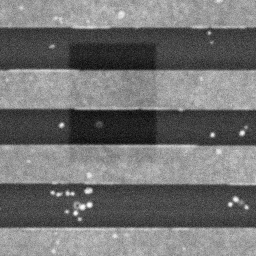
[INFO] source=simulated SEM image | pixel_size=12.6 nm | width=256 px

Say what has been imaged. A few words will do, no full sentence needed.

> lines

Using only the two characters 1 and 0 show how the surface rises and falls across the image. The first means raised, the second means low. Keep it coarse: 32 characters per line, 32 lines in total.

11111111111111111111111111111111
11111111111111111111111111111111
11111111111111111111111111111111
00000000000000000000000000000000
00000000000000000000000000000000
00000000000000000000000000000000
00000000000000000000000000000000
00000000000000000000000000000000
00000000000000000000000000000000
11111111111111111111111111111111
11111111111111111111111111111111
11111111111111111111111111111111
11111111111111111111111111111111
00000000011111111111111111111111
00000000000000000000000000000000
00000000000000000000000000000000
00000000000000000000000000000000
00000000000000000000000000000000
11111111111111111111111111111111
11111111111111111111111111111111
11111111111111111111111111111111
11111111111111111111111111111111
11111111111111111111111111111111
00000000000000000000000000000000
00000000000000000000000000000000
00000000000000000000000000000000
00000000000000000000000000000000
00000000000000000000000000000000
00000000000000000000000000000000
11111111111111111111111111111111
11111111111111111111111111111111
11111111111111111111111111111111